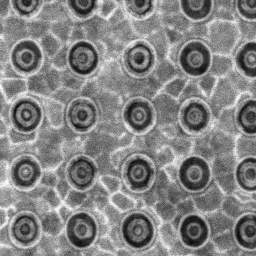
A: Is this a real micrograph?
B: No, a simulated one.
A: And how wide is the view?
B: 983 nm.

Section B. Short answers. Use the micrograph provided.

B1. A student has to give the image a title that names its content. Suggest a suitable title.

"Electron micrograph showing a regular array of ring-shaped raised bodies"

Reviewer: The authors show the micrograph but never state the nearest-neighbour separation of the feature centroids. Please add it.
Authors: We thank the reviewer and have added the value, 216 nanometres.